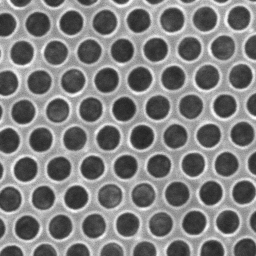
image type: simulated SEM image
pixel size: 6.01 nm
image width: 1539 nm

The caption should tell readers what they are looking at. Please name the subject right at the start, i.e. a regular array of holes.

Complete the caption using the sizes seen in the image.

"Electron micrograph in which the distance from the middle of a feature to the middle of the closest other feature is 0.199 µm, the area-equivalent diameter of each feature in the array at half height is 150 nanometres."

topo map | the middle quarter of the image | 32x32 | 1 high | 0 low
11111111111111111111111111101111
10001111100001111000011110000011
00000111000000110000001100000011
00000111000000110000001100000011
00000111000000110000001100000011
00000111000001110000001110000011
00001111000001111000111111001111
11111111111111111111111111111110
11111100111111001111100000111100
01110000011100000111100000111000
01110000001100000011000000011000
00110000001100000011000000111000
01110000001100000011100000111000
01110000011110000111110001111100
11111101111111111111111111111111
11011111110011111100011111000011
10000111100000111000001110000001
00000111000000111000000110000001
00000011000000110000000110000001
00000011000000111000001110000001
00000111100001111000001111000011
10001111110001111110111111111111
11111111111111111111111101111110
01111000011110000011100000111100
00111000001100000011100000011000
00110000001100000001100000011000
00110000001100000011100000011100
00110000001110000011100000111100
01111000011111000111111011111111
11111111111111111111111111100111
11001111110000111100001111000001
10000111100000111000000110000001